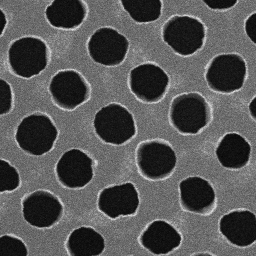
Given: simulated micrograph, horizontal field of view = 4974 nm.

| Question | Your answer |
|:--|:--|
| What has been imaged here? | a regular array of holes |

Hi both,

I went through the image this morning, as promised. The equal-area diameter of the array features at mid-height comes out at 0.717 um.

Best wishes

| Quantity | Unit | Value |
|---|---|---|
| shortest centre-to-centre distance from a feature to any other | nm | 1020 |